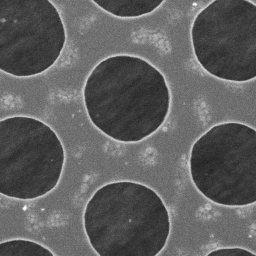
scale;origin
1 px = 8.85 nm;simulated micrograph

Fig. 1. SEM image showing holes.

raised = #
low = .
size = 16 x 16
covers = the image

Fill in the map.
...###....###...
....########....
....########....
....########....
...###....###...
#####.....######
#####......#####
..####....######
...####..####...
....########....
....########....
...####..###....
######....###...
#####.....######
#####......#####
...###....######